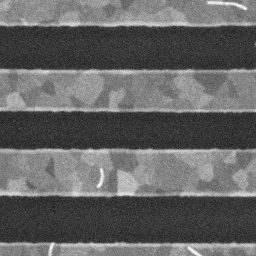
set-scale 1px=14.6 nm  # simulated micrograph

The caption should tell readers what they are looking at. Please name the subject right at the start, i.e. lines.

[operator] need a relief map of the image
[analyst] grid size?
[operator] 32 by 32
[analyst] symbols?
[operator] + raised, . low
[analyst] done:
++++++++++++++++++++++++++++++++
++++++++++++++++++++++++++++++++
++++++++++++++++++++++++++++++++
................................
................................
................................
................................
................................
................................
++++++++++++++++++++++++++++++++
++++++++++++++++++++++++++++++++
++++++++++++++++++++++++++++++++
++++++++++++++++++++++++++++++++
++++++++++++++++++++++++++++++++
................................
................................
................................
................................
................................
++++++++++++++++++++++++++++++++
++++++++++++++++++++++++++++++++
++++++++++++++++++++++++++++++++
++++++++++++++++++++++++++++++++
++++++++++++++++++++++++++++++++
................................
................................
................................
................................
................................
................................
+....++.........................
++++++++++++++++++++++++++++++++